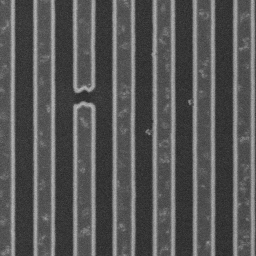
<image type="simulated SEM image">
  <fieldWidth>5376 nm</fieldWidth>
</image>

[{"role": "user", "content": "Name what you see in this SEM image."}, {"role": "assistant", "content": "parallel lines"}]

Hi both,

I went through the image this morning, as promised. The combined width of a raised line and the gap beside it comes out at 838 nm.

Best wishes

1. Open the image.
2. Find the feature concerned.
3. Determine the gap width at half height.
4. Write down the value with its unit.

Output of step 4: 438 nm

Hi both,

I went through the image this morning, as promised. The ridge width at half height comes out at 18.9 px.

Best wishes